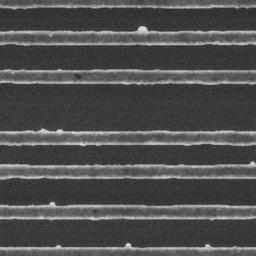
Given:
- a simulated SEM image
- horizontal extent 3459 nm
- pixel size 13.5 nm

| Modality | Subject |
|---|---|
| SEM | lines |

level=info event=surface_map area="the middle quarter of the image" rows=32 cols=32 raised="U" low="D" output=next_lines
DDDDDDDDDDDDDDDDDDDDDDDDDDDDDDDD
DDDDDDDDUDDDUDDUUUDDDDDDDDDDDDDD
UUUUUUUUUUUUUUUUUUUUUUUUUUUUUUUU
UUUUUUUUUUUUUUUUUUUUUUUUUUUUUUUU
UUUUUUUUUUUUUUUUUUUUUUUUUUUUUUUU
DDDDDDDDDDDDDDDDDDDDDDDDDDDDDDDD
DDDDDDDDDDDDDDDDDDDDDDDDDDDDDDDD
DDDDDDDDDDDDDDDDDDDDDDDDDDDDDDDD
DDDDDDDDDDDDDDDDDDDDDDDDDDDDDDDD
DDDDDDDDDDDDDDDDDDDDDDDDDDDDDDDD
DDDDDDDDDDDDDDDDDDDDDDDDDDDDDDDD
DDDDDDDDDDDDDDDDDDDDDDDDDDDDDDDD
DDDDDDDDDDDDDDDDDDDDDDDDDDDDDDDD
DDDDDDDDDDDDDDDDDDDDDDDDDDDDDDDD
DDDDDDDDDDDDDDDDDDDDDDDDDDDDDDDD
DDDDDDDDDDDDDDDDDDDDDDDDDDDDDDDD
DDDDDDDDDDDDDDDDDDDDDDDDDDDDDDDD
UUUUUUUUUUUUUUUUUUUUUUUUUUUUUUUU
UUUUUUUUUUUUUUUUUUUUUUUUUUUUUUUU
UUUUUUUUUUUUUUUUUUUUUUUUUUUUUUUU
DDDDDDDDDDDDDDDDDDDDDDDDDDDDDDDD
DDDDDDDDDDDDDDDDDDDDDDDDDDDDDDDD
DDDDDDDDDDDDDDDDDDDDDDDDDDDDDDDD
DDDDDDDDDDDDDDDDDDDDDDDDDDDDDDDD
DDDDDDDDDDDDDDDDDDDDDDDDDDDDDDDD
UUUUUUUUUUUUUUUUUUUUUUUUUUUUUUUU
UUUUUUUUUUUUUUUUUUUUUUUUUUUUUUUU
UUUUUUUUUUUUUUUUUUUUUUUUUUUUUUUU
DUUUUUUUUUUUDUUDUUUUUUUUUUDDUUUU
DDDDDDDDDDDDDDDDDDDDDDDDDDDDDDDD
DDDDDDDDDDDDDDDDDDDDDDDDDDDDDDDD
DDDDDDDDDDDDDDDDDDDDDDDDDDDDDDDD